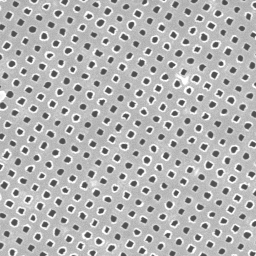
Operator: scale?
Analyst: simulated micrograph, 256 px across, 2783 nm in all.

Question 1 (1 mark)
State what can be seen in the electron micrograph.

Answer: a regular array of holes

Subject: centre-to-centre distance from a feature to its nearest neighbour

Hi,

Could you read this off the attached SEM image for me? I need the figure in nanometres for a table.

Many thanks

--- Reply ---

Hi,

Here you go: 143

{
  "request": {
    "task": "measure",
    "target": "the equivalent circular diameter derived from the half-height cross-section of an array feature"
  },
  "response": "0.0694 microns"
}